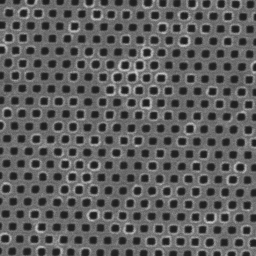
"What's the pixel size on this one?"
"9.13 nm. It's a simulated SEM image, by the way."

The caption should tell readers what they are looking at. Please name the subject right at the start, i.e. a regular array of holes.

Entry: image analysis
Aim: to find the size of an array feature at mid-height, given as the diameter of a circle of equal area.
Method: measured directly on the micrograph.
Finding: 81.1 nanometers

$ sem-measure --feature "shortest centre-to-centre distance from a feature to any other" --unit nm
128